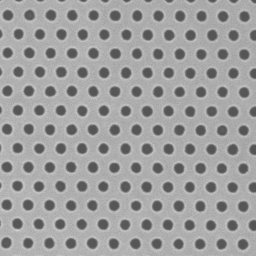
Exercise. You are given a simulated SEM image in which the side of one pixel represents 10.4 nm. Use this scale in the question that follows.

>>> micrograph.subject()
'a regular array of holes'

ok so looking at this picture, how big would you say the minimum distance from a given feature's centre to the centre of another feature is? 221 nm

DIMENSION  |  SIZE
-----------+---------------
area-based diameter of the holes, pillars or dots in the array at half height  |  116 nm